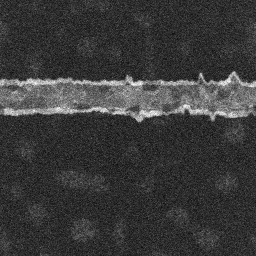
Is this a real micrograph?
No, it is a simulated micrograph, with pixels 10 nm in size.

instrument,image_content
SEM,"one or a few lines or trenches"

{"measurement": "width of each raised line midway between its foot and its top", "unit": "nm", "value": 300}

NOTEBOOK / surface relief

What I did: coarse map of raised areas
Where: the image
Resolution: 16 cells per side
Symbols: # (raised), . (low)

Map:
................
................
................
................
................
################
################
................
................
................
................
................
................
................
................
................